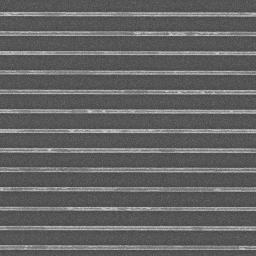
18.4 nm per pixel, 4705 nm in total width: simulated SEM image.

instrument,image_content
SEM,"parallel lines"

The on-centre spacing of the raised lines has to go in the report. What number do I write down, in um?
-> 0.357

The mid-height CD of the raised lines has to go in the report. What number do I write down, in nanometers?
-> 64.3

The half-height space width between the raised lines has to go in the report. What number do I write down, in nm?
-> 285